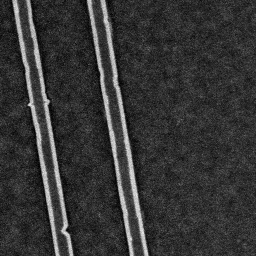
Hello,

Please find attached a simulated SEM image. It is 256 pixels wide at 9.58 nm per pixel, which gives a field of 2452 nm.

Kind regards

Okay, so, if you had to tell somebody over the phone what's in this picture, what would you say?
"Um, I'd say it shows one or a few lines or trenches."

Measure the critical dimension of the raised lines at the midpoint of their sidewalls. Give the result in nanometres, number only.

137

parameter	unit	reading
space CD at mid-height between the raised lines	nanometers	566